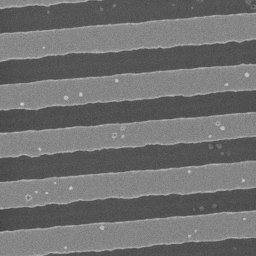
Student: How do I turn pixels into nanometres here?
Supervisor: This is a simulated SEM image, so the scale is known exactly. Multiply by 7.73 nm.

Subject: lines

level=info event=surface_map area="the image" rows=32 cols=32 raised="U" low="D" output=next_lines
UUUUUUUDDDDDDDDDDDDDDDDDDDDDDDDD
DDDDDDDDDDDDDDDDDDDDDDDDDDDDDDDD
DDDDDDDDDDDDDDDDDDDDDDUUUUUUUUUU
DDDDDDDDDDUUUUUUUUUUUUUUUUUUUUUU
UUUUUUUUUUUUUUUUUUUUUUUUUUUUUUUU
UUUUUUUUUUUUUUUUUUUUUUUUUUDDDDDD
UUUUUUUUUUUUUDDDDDDDDDDDDDDDDDDD
UDDDDDDDDDDDDDDDDDDDDDDDDDDDDDDD
DDDDDDDDDDDDDDDDDDDDDDDDUUUUUUUU
DDDDDDDDDDDDDDUUUUUUUUUUUUUUUUUU
DDUUUUUUUUUUUUUUUUUUUUUUUUUUUUUU
UUUUUUUUUUUUUUUUUUUUUUUUUUUDDDDD
UUUUUUUUUUUUUUUUUDDDDDDDDDDDDDDD
UUUUUDDDDDDDDDDDDDDDDDDDDDDDDDDD
DDDDDDDDDDDDDDDDDDDDDDDDDDDUUUUU
DDDDDDDDDDDDDDDUUUUUUUUUUUUUUUUU
DDDUUUUUUUUUUUUUUUUUUUUUUUUUUUUU
UUUUUUUUUUUUUUUUUUUUUUUUUUUUDDDD
UUUUUUUUUUUUUUUDDDDDDDDDDDDDDDDD
UUDUUDDDDDDDDDDDDDDDDDDDDDDDDDDD
DDDDDDDDDDDDDDDDDDDDDDDDDDDDDUUU
DDDDDDDDDDDDDDDUUUUUUUUUUUUUUUUU
DDUUUUUUUUUUUUUUUUUUUUUUUUUUUUUU
UUUUUUUUUUUUUUUUUUUUUUUUUUUUUUUD
UUUUUUUUUUUUUUUUUUDDDDDDDDDDDDDD
UUUUUUDDDDDDDDDDDDDDDDDDDDDDDDDD
DDDDDDDDDDDDDDDDDDDDDDDDDDDDDDUU
DDDDDDDDDDDDDDDDDDUUUUUUUUUUUUUU
DDDDDDUUUUUUUUUUUUUUUUUUUUUUUUUU
UUUUUUUUUUUUUUUUUUUUUUUUUUUUUUUU
UUUUUUUUUUUUUUUUUUUUUUDDDDDDDDDD
UUUUUUUUUUDDDDDDDDDDDDDDDDDDDDDD